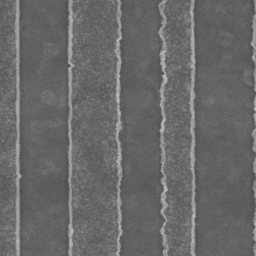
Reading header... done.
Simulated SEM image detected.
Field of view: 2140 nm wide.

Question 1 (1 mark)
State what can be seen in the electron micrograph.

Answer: one or a few lines or trenches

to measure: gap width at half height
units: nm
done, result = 430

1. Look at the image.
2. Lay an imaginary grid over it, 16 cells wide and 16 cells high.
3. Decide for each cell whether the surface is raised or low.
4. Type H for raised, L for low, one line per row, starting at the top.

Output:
HLLLHHHLLLHHLLLL
HLLLHHHLLLHHLLLL
HLLLHHHLLLHHLLLL
HLLLHHHLLLHHLLLL
HLLLHHHLLLHHLLLL
HLLLHHHLLLHHLLLL
HLLLHHHLLLHHLLLL
HLLLHHHLLLHHLLLL
HLLLHHHLLLHHLLLL
HLLLHHHLLLHHLLLL
HLLLHHHLLLHHLLLL
HLLLHHHLLLHHLLLL
HLLLHHHLLLHHLLLL
HLLLHHHLLLHHLLLL
HLLLHHHLLLHHLLLL
HLLLHHHLLLHHLLLL